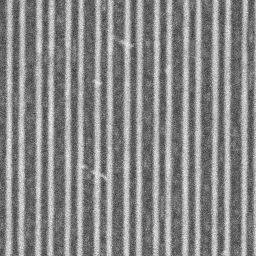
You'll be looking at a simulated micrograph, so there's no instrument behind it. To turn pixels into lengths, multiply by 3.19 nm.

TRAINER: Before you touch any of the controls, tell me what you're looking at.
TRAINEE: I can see parallel lines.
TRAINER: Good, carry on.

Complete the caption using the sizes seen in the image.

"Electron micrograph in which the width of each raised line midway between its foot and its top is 13.5 nanometres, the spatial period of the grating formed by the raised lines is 14.7 px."